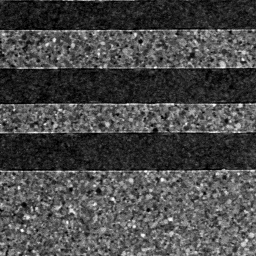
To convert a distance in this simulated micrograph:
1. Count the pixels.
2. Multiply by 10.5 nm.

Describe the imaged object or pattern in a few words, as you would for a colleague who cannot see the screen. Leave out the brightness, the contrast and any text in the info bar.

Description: one or a few lines or trenches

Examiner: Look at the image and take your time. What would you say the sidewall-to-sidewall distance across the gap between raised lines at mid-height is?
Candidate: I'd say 36.1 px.